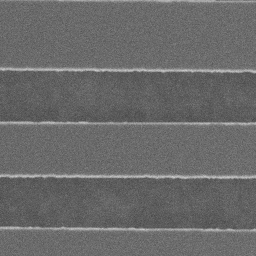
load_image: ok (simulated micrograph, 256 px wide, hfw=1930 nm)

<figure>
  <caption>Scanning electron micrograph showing lines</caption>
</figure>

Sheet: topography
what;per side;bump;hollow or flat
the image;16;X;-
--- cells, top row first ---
XXXXXXXXXXXXXXXX
XXXXXXXXXXXXXXXX
XXXXXXXXXXXXXXXX
XXXXXXXXXXXXXXXX
----------------
----------------
----------------
----------------
XXXXXXXXXXXXXXXX
XXXXXXXXXXXXXXXX
XXXXXXXXXXXXXXXX
----------------
----------------
----------------
XXXXXXXXXXXXXXXX
XXXXXXXXXXXXXXXX